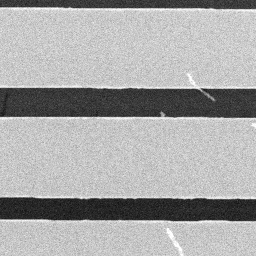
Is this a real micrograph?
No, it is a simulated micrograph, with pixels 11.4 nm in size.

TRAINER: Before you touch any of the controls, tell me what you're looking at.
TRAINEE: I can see lines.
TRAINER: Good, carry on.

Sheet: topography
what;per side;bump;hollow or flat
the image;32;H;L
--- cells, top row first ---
LLLLLLLLLLLLLLLLLLLLLLLLLLLLLLLL
HHHHHHHHHHHHHHHHHHHHHHHHHHHHHHHH
HHHHHHHHHHHHHHHHHHHHHHHHHHHHHHHH
HHHHHHHHHHHHHHHHHHHHHHHHHHHHHHHH
HHHHHHHHHHHHHHHHHHHHHHHHHHHHHHHH
HHHHHHHHHHHHHHHHHHHHHHHHHHHHHHHH
HHHHHHHHHHHHHHHHHHHHHHHHHHHHHHHH
HHHHHHHHHHHHHHHHHHHHHHHHHHHHHHHH
HHHHHHHHHHHHHHHHHHHHHHHHHHHHHHHH
HHHHHHHHHHHHHHHHHHHHHHHHHHHHHHHH
HHHHHHHHHHHHHHHHHHHHHHHHHHHHHHHH
LLLLLLLLLLLLLLLLLLLLLLLLLLLLLLLL
LLLLLLLLLLLLLLLLLLLLLLLLLLLLLLLL
LLLLLLLLLLLLLLLLLLLLLLLLLLLLLLLL
LLLLLLLLLLLLLLLLLLLLLLLLLLLLLLLL
HHHHHHHHHHHHHHHHHHHHHHHHHHHHHHHH
HHHHHHHHHHHHHHHHHHHHHHHHHHHHHHHH
HHHHHHHHHHHHHHHHHHHHHHHHHHHHHHHH
HHHHHHHHHHHHHHHHHHHHHHHHHHHHHHHH
HHHHHHHHHHHHHHHHHHHHHHHHHHHHHHHH
HHHHHHHHHHHHHHHHHHHHHHHHHHHHHHHH
HHHHHHHHHHHHHHHHHHHHHHHHHHHHHHHH
HHHHHHHHHHHHHHHHHHHHHHHHHHHHHHHH
HHHHHHHHHHHHHHHHHHHHHHHHHHHHHHHH
HHHHHHHHHHHHHHHHHHHHHHHHHHHHHHHH
LLLLLLLLLLLLLLLLLLLLLLLLLLLLLLLL
LLLLLLLLLLLLLLLLLLLLLLLLLLLLLLLL
LLLLLLLLLLLLLLLLLLLLLLLLLLLLLLLL
HHHHHHHHHHHHHHHHHHHHHHHHHHHHHHHH
HHHHHHHHHHHHHHHHHHHHHHHHHHHHHHHH
HHHHHHHHHHHHHHHHHHHHHHHHHHHHHHHH
HHHHHHHHHHHHHHHHHHHHHHHHHHHHHHHH